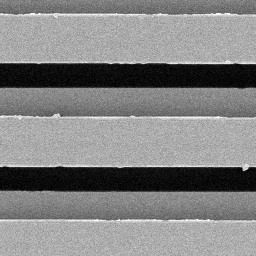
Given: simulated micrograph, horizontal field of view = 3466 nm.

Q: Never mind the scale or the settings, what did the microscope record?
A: lines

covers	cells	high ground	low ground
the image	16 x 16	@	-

@@@@@@@@@@@@@@@@
@@@@@@@@@@@@@@@@
@@@@@@@@@@@@@@@@
@@@@@@@@@@@@@@@@
----------------
----------------
@@@@@@@@@@@@@@@@
@@@@@@@@@@@@@@@@
@@@@@@@@@@@@@@@@
@@@@@@@@@@@@@@@@
----------------
----------------
@@@@@@@@@@@@@@@@
@@@@@@@@@@@@@@@@
@@@@@@@@@@@@@@@@
@@@@@@@@@@@@@@@@